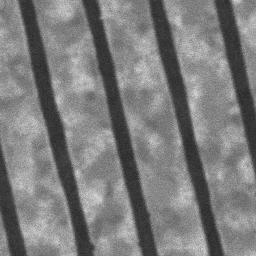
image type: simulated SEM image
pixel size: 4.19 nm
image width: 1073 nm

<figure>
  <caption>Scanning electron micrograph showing one or a few lines or trenches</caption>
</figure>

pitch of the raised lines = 267 nanometres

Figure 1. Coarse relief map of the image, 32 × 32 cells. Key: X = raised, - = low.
XX--XXXXXX--XXXXXXX--XXXXXX--XXX
XX---XXXXXX--XXXXXX--XXXXXX--XXX
XXX--XXXXXX--XXXXXX--XXXXXX---XX
XXX--XXXXXX--XXXXXX--XXXXXXX--XX
XXX--XXXXXX--XXXXXX---XXXXXX--XX
XXX---XXXXXX--XXXXXX--XXXXXX--XX
XXX---XXXXXX--XXXXXX--XXXXXX--XX
XXXX--XXXXXX--XXXXXX--XXXXXX---X
XXXX--XXXXXX--XXXXXX---XXXXXX--X
XXXX--XXXXXXX--XXXXXX--XXXXXX--X
XXXX---XXXXXX--XXXXXX--XXXXXX--X
XXXXX--XXXXXX--XXXXXX--XXXXXX--X
XXXXX--XXXXXX--XXXXXX---XXXXXX--
XXXXX--XXXXXX---XXXXXX--XXXXXX--
XXXXX---XXXXXX--XXXXXX--XXXXXX--
XXXXX---XXXXXX--XXXXXX--XXXXXX--
XXXXXX--XXXXXX--XXXXXX--XXXXXXX-
XXXXXX--XXXXXX---XXXXXX--XXXXXX-
XXXXXX---XXXXX---XXXXXX--XXXXXX-
-XXXXXX--XXXXXX--XXXXXX--XXXXXX-
-XXXXXX--XXXXXX--XXXXXX--XXXXXX-
-XXXXXX--XXXXXX--XXXXXX---XXXXXX
-XXXXXX---XXXXX---XXXXXX--XXXXXX
--XXXXXX--XXXXXX--XXXXXX--XXXXXX
--XXXXXX--XXXXXX--XXXXXX--XXXXXX
--XXXXXX--XXXXXX--XXXXXXX--XXXXX
--XXXXXXX--XXXXX---XXXXXX--XXXXX
--XXXXXXX--XXXXXX--XXXXXX--XXXXX
---XXXXXX--XXXXXX--XXXXXX--XXXXX
X--XXXXXX--XXXXXX--XXXXXXX--XXXX
X--XXXXXX---XXXXX---XXXXXX--XXXX
X--XXXXXX---XXXXXX--XXXXXX--XXXX